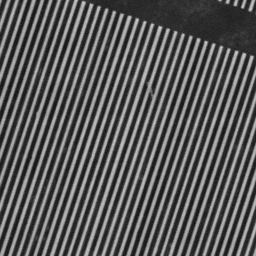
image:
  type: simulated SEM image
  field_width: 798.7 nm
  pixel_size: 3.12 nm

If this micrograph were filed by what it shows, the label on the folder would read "parallel lines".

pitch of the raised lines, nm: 25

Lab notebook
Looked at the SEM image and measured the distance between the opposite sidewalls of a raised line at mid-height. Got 9.3 nanometers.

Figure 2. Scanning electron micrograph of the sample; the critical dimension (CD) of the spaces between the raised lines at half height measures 15.2 nm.